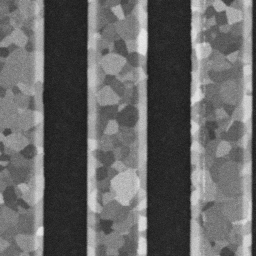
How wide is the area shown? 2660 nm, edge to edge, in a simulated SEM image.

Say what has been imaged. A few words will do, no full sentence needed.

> one or a few lines or trenches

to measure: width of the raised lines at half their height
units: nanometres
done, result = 522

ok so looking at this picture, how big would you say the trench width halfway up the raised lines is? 560 nanometers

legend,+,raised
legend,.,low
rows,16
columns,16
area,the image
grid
++....+++...+++.
++....+++...+++.
++....+++...+++.
++....+++...+++.
++....+++...+++.
++....+++...+++.
++....+++...+++.
++....+++...+++.
++....+++...+++.
++....+++...+++.
++....+++...+++.
++....+++...+++.
++....+++...+++.
++....+++...+++.
++....+++...+++.
++....+++...+++.